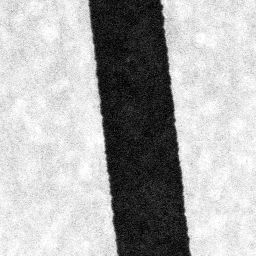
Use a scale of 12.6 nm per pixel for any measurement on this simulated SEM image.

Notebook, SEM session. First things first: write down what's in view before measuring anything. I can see one or a few lines or trenches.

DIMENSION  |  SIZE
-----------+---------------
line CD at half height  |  75.1 px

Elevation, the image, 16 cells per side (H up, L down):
LLLLLLHHHHLLLLLL
LLLLLLHHHHLLLLLL
LLLLLLHHHHLLLLLL
LLLLLLHHHHHLLLLL
LLLLLLHHHHHLLLLL
LLLLLLHHHHHLLLLL
LLLLLLHHHHHLLLLL
LLLLLLHHHHHLLLLL
LLLLLLHHHHHLLLLL
LLLLLLHHHHHLLLLL
LLLLLLLHHHHLLLLL
LLLLLLLHHHHHLLLL
LLLLLLLHHHHHLLLL
LLLLLLLHHHHHLLLL
LLLLLLLHHHHHLLLL
LLLLLLLHHHHHLLLL